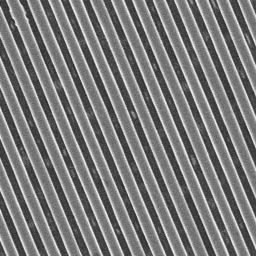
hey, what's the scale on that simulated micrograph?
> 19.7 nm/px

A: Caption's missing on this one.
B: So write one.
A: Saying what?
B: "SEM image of parallel lines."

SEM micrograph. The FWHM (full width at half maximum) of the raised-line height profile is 223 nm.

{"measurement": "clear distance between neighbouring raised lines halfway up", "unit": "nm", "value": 166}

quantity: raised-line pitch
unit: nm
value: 382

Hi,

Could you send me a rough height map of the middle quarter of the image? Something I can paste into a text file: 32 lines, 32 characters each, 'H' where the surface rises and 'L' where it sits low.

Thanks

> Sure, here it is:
HLLHHHLLHHHLLHHHLLLHHHLLHHHLLHHH
HLLHHHLLLHHHLLHHHLLHHHLLHHHLLLHH
HLLLHHHLLHHHLLHHHLLLHHHLLHHHLLHH
HHLLHHHLLHHHLLLHHHLLHHHLLHHHLLLH
HHLLHHHHLLHHHLLHHHLLHHHLLLHHHLLH
HHHLLHHHLLHHHLLLHHHLLHHHLLHHHLLH
HHHLLHHHLLLHHHLLHHHLLHHHLLHHHLLL
LHHHLLHHHLLHHHLLHHHLLHHHLLLHHHLL
LHHHLLHHHLLHHHHLLHHHLLHHHLLHHHLL
LHHHLLHHHHLLHHHLLHHHLLHHHLLLHHHL
LLHHHLLHHHLLHHHLLLHHHLLHHHLLHHHL
LLHHHLLLHHHLLHHHLLHHHLLHHHLLHHHL
LLLHHHLLHHHLLHHHLLHHHLLHHHHLLHHH
HLLHHHLLHHHLLHHHLLLHHHLLHHHLLHHH
HLLHHHLLLHHHLLHHHLLHHHLLHHHLLLHH
HLLLHHHLLHHHLLHHHLLLHHHLLHHHLLHH
HHLLHHHLLHHHHLLHHHLLHHHLLHHHLLLH
HHLLLHHHLLHHHLLHHHLLHHHLLLHHHLLH
HHHLLHHHLLHHHLLHHHHLLHHHLLHHHLLH
HHHLLHHHLLLHHHLLHHHLLHHHLLLHHLLL
HHHLLLHHHLLHHHLLHHHLLLHHHLLHHHLL
LHHHLLHHHLLLHHHLLHHHLLHHHLLHHHLL
LHHHLLLHHHLLHHHLLHHHLLLHHHLLHHHL
LLHHHLLHHHLLHHHLLLHHHLLHHHLLHHHL
LLHHHLLHHHHLLHHHLLHHHLLHHHLLHHHL
LLLHHHLLHHHLLHHHLLHHHLLLHHHLLHHH
HLLHHHLLHHHLLLHHHLLHHHLLHHHLLHHH
HLLHHHLLLHHHLLHHHLLHHHLLLHHHLLHH
HHLLHHHLLHHHLLHHHHLLHHHLLHHHLLHH
HHLLHHHLLLHHHLLHHHLLHHHLLHHHLLHH
HHHLLHHHLLHHHLLHHHLLHHHLLLHHHLLH
HHHLLHHHLLHHHLLHHHLLLHHHLLHHHLLH